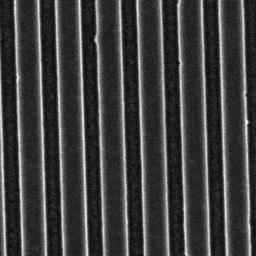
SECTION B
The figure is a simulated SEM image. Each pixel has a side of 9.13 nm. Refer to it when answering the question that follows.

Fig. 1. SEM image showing parallel lines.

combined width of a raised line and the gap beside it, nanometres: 373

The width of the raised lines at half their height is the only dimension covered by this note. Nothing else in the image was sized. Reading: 221 nm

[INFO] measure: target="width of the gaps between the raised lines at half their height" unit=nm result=153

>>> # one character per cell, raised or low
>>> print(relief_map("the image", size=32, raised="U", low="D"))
DDUUUDDUUUDDUUUDDUUUDDUUUDDUUUDD
DDUUUDDUUUDDUUUDDUUUDDUUUDDUUUDD
DDUUUDDUUUDDUUUDDUUUDDUUUDDUUUDD
DDUUUDDUUUDDUUUDDUUUDDUUUDDDUUDD
DDUUUDDUUUDDUUUDDUUUDDUUUDDDUUDD
DDUUUDDUUUDDUUUDDUUUDDUUUDDDUUUD
DDUUUDDUUUDDUUUDDUUUDDUUUDDDUUUD
DDUUUDDUUUDDUUUDDUUUDDDUUDDDUUUD
DDUUUDDUUUDDUUUDDUUUDDDUUDDDUUUD
DDUUUDDUUUDDUUUDDUUUDDDUUUDDUUUD
DDUUUDDUUUDDUUUDDUUUDDDUUUDDUUUD
DDUUUDDUUUDDUUUDDDUUDDDUUUDDUUUD
DDUUUDDUUUDDUUUDDDUUDDDUUUDDUUUD
DDUUUDDUUUDDUUUDDDUUUDDUUUDDUUUD
DDUUUDDUUUDDUUUDDDUUUDDUUUDDUUUD
DDUUUDDUUUDDDUUDDDUUUDDUUUDDUUUD
DDUUUDDUUUDDDUUDDDUUUDDUUUDDUUUD
DDUUUDDUUUDDDUUUDDUUUDDUUUDDUUUD
DDUUUDDUUUUDDUUUDDUUUDDUUUDDUUUD
DDDUUDDDUUUDDUUUDDUUUDDUUUDDUUUD
DDDUUDDDUUUDDUUUDDUUUDDUUUDDUUUD
DDDUUDDDUUUDDUUUDDUUUDDUUUDDUUUD
DDUUUUDDUUUDDUUUDDUUUDDUUUDDUUUD
DDDUUUDDUUUDDUUUDDUUUDDUUUDDUUUD
DDDUUUDDUUUDDUUUDDUUUDDUUUDDUUUD
DDDUUUDDUUUDDUUUDDUUUDDUUUDDUUUD
UDDUUUDDUUUDDUUUDDUUUDDUUUDDUUUD
UDDUUUDDUUUDDUUUDDUUUDDUUUDDUUUD
UDDUUUDDUUUDDUUUDDUUUDDUUUDDUUUD
UDDUUUDDUUUDDUUUDDUUUDDUUUDDUUUD
UDDUUUDDUUUDDUUUDDUUUDDUUUDDUUUD
UDDUUUDDUUUDDUUUDDUUUDDUUUDDUUUD